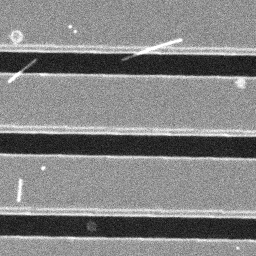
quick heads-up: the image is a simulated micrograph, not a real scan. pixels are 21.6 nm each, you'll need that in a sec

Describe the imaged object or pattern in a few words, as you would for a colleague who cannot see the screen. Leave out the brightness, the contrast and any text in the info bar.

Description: lines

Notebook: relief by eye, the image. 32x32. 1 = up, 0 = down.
11111111111111111111111111111111
11111111111111111111111111111111
11111111111111111111111111111111
11111111111111111111111111111111
11111111111111111111111111111111
11111111111111111111111111111111
00000000000111111111111111111111
00000000000000000000000000000000
00000000000000000000000000000000
11111111111111111111100000000000
11111111111111111111111111111111
11111111111111111111111111111111
11111111111111111111111111111111
11111111111111111111111111111111
11111111111111111111111111111111
11111111111111111111111111111111
11111111111111111111111111111111
00000000000000000000000000000000
00000000000000000000000000000000
11111111000000000000000000000000
11111111111111111111111111111111
11111111111111111111111111111111
11111111111111111111111111111111
11111111111111111111111111111111
11111111111111111111111111111111
11111111111111111111111111111111
11111111111111111111111111111111
00000000000000000000000000000000
00000000000000000000000000000000
00000000000000000000000000000000
11111111111111111111111111111111
11111111111111111111111111111111